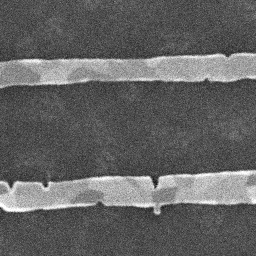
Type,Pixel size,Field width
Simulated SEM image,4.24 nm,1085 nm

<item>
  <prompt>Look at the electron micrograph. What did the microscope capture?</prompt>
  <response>one or a few lines or trenches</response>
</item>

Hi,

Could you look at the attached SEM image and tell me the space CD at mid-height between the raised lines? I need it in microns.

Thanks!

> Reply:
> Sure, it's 0.41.